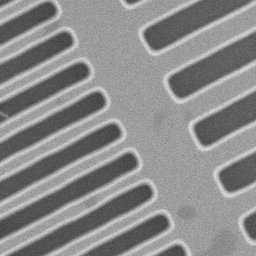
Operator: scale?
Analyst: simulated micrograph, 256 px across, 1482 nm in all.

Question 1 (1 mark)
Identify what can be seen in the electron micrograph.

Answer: groups of lines, slits or small figures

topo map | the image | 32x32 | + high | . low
.++++..+++++++++.+++++++.......+
+++....+++++++++++++++.......+++
+.....++++++++++++++.......+++++
....++++++++++++++.......+++++++
..++++...+++++++++......++++++..
.++++....+++++++++....++++++....
+++.....+++++++++++++++++++.....
+.....+++++++++++++++++++.......
....++++...++++++++++++.......++
..++++.....++++++++++.......++++
++++......+++++++++++......+++++
++......++++.++++++++....++++++.
......++++...++++++++++++++++...
....++++.....+++++++++++++++....
..++++.....+++++++++++++++......
++++.....++++..+++++++++.......+
++.....++++....+++++++++.....+++
.....+++++.....++++++++++...++++
....++++.....+++++++++++++++++++
..++++.....++++..++++++++++++++.
++++.....++++....++++++++++++...
++.....++++.....+++++++++++.....
.....++++......++++++++++++.....
...++++......+++...+++++++++...+
..++++.....++++....+++++++++++++
++++.....++++.....++++++++++++++
++.....++++.....++++++++++++++++
.....++++.....++++...+++++++++..
...++++.....++++.....+++++++++..
.++++.....++++......+++++++++++.
+++......+++......++++++++++++++
++.....++++.....++++...+++++++++